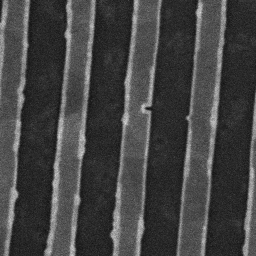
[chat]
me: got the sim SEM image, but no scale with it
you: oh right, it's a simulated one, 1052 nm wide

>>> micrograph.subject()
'one or a few lines or trenches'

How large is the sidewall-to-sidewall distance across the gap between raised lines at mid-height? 0.157 microns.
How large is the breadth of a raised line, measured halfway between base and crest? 25.8 px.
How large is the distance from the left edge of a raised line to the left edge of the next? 267 nanometres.